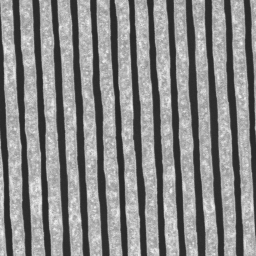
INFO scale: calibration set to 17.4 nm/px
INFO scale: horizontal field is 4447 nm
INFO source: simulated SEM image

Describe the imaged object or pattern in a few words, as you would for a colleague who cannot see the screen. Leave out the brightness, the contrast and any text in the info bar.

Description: parallel lines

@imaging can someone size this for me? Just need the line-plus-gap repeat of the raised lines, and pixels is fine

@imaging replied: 19.2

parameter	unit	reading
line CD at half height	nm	228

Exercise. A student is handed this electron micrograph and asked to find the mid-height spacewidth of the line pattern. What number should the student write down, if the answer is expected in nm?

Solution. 115